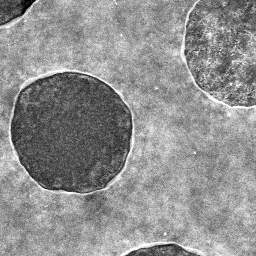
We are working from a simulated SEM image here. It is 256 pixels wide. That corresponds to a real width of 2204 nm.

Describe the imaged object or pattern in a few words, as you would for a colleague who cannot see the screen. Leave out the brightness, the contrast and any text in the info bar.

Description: holes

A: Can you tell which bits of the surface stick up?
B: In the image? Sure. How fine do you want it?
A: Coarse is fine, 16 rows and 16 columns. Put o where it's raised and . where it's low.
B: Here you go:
..oooooooooo....
oooooooooooo....
oooooooooooo....
oooooooooooo....
oooo.ooooooo....
o......oooooo...
o.......oooooo..
o.......oooooooo
o.......oooooooo
o.......oooooooo
oo......oooooooo
oo.....ooooooooo
oooooooooooooooo
oooooooooooooooo
oooooooooooooooo
ooooooooo...oooo